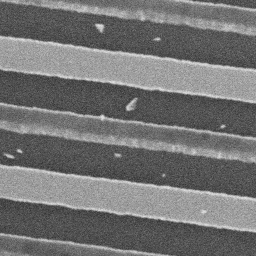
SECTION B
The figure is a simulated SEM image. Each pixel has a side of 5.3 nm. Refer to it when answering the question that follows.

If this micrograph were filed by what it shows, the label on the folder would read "lines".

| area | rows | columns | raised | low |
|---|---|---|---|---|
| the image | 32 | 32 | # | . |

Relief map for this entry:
......#####################.....
..............##################
.......................#########
............................####
................................
#######.........................
##############..................
######################..........
##############################..
.......#########################
...............#################
......................##########
..............................##
#####...........................
############....................
###################.............
.......####################.....
..............##################
......................##########
..............................##
................................
######..........................
##############..................
######################..........
#############################...
......##########################
..............##################
.....................###########
............................####
##..............................
##########......................
##################..............